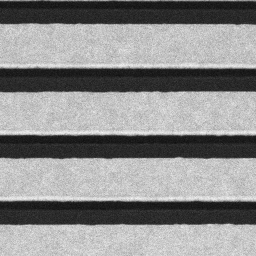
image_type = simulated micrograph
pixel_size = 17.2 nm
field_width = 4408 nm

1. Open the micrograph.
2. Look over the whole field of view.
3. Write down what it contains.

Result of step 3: lines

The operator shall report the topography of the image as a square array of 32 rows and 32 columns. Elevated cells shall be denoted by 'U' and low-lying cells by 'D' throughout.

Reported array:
DDDDDDDDDDDDDDDDDDDDDDDDDDDDDDDD
DDDDDDDDDDDDDDDDDDDDDDDDDDDDDDDD
DDDDDDDDDDDDDDDDDDDDDDDDDDDDDDDD
UUUUUUUUUUUUUUUUUUUUUUUUUUUUUUUU
UUUUUUUUUUUUUUUUUUUUUUUUUUUUUUUU
UUUUUUUUUUUUUUUUUUUUUUUUUUUUUUUU
UUUUUUUUUUUUUUUUUUUUUUUUUUUUUUUU
UUUUUUUUUUUUUUUUUUUUUUUUUUUUUUUU
UUUUDDUUDDDUUUUUUUUDUUUUUUUUUUUU
DDDDDDDDDDDDDDDDDDDDDDDDDDDDDDDD
DDDDDDDDDDDDDDDDDDDDDDDDDDDDDDDD
DDDDDDDDDDDDDDDDDDDDDDDDDDDDDDDD
UUUUUUUUUUUUUUUUUUUUUUUUUUUUUUUU
UUUUUUUUUUUUUUUUUUUUUUUUUUUUUUUU
UUUUUUUUUUUUUUUUUUUUUUUUUUUUUUUU
UUUUUUUUUUUUUUUUUUUUUUUUUUUUUUUU
UUUUUUUUUUUUUUUUUUUUUUUUUUUUUUUU
DDDDDDDDDDDDDDDDDDDDDDDDDDDDDDDD
DDDDDDDDDDDDDDDDDDDDDDDDDDDDDDDD
DDDDDDDDDDDDDDDDDDDDDDDDDDDDDDDD
UUUUUUUUUUUUUUUUUUUUUUUUUUUUUUUU
UUUUUUUUUUUUUUUUUUUUUUUUUUUUUUUU
UUUUUUUUUUUUUUUUUUUUUUUUUUUUUUUU
UUUUUUUUUUUUUUUUUUUUUUUUUUUUUUUU
UUUUUUUUUUUUUUUUUUUUUUUUUUUUUUUU
DDDDDDDDDDDDDDDDDDDDDDDDDDDDDDDD
DDDDDDDDDDDDDDDDDDDDDDDDDDDDDDDD
DDDDDDDDDDDDDDDDDDDDDDDDDDDDDDDD
UUUUUUUUUUUUUUUUUUUUUUUUUUUUUUUU
UUUUUUUUUUUUUUUUUUUUUUUUUUUUUUUU
UUUUUUUUUUUUUUUUUUUUUUUUUUUUUUUU
UUUUUUUUUUUUUUUUUUUUUUUUUUUUUUUU